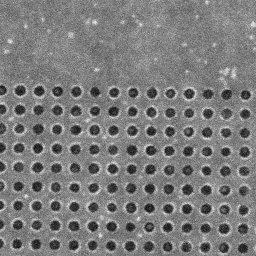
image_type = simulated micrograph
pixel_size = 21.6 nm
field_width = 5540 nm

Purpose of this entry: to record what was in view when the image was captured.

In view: a regular array of holes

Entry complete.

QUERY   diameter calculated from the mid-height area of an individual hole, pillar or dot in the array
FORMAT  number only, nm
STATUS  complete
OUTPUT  243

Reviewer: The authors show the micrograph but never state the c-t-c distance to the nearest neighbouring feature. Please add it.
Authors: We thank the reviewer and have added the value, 404 nm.